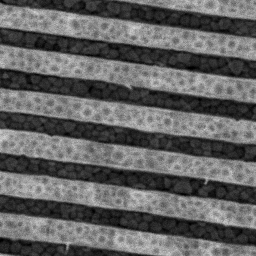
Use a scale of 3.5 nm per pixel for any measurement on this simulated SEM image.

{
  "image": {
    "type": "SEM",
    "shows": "parallel lines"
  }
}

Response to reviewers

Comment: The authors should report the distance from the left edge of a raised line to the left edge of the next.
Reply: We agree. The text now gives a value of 145 nanometers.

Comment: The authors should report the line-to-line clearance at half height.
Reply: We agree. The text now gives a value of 71.2 nanometres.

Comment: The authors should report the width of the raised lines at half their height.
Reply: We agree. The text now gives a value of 21.2 pixels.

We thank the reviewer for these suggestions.